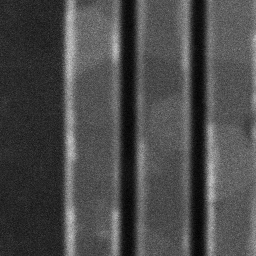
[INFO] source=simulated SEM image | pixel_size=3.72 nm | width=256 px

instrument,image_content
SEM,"one or a few lines or trenches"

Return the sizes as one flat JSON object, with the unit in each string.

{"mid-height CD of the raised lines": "194 nm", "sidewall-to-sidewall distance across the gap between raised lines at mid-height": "65.1 nm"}